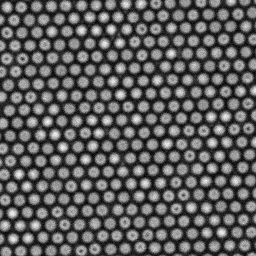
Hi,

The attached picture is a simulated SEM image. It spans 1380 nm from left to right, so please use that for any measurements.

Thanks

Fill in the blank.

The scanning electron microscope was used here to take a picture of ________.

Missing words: a regular array of raised bodies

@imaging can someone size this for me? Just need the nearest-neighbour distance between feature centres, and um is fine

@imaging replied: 0.0766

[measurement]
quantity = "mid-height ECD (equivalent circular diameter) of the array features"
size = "58.4 nanometers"